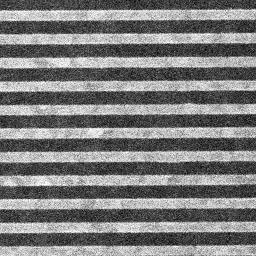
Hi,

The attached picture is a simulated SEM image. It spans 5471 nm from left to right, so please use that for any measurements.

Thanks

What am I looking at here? parallel lines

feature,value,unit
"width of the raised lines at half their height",195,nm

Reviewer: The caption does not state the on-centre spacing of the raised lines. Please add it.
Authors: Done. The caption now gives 504 nm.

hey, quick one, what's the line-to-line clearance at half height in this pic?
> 0.304 microns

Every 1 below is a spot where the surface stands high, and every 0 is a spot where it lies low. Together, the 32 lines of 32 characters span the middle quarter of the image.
11111111111111111111111111111111
00000000000000000000000000000000
00000000000000000000000000000000
00000000000000000000000000000000
01111111101011111100000011111111
11111111111111111111111111111111
11111111111111111111111111110000
00000000000000000000000000000000
00000000000000000000000000000000
00000000000000000000000000000000
11111111111111111111111111111111
11111111111111111111111111111111
01111100000000000000000000000000
00000000000000000000000000000000
00000000000000000000000000000000
00000000000000000000000000000000
11111111111111111111111111111111
11111111111111111111111111111111
00000000000000000000000000000000
00000000000000000000000000000000
00000000000000000000000000000000
00000000000000000000000000000000
11111111111111111111111111111111
11111111111111111111111111111111
00000000000000000000000000000000
00000000000000000000000000000000
00000000000000000000000000000000
00000000000000000000000000000000
11111111111111111111111111111111
11111111111111111111111111111111
00000000000000000000000000000000
00000000000000000000000000000000